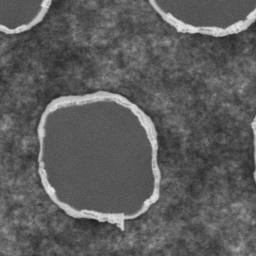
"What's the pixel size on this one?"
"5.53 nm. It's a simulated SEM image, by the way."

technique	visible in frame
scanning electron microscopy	raised bodies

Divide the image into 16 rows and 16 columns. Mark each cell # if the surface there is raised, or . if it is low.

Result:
###.......######
##.........####.
................
................
................
................
...#####........
...######.......
..########......
..########......
..########......
...#######......
...#######......
.....###........
................
................